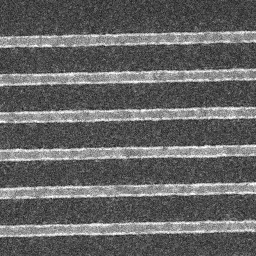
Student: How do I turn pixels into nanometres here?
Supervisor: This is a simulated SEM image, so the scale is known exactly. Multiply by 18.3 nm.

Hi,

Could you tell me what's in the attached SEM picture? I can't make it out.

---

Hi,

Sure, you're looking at parallel lines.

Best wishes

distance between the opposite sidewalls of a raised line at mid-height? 201 nm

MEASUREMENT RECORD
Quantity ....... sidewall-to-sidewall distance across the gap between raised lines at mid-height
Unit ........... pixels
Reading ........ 26.7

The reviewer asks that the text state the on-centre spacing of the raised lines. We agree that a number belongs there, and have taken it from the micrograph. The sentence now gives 692 nm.